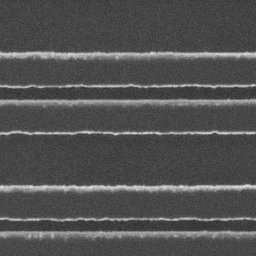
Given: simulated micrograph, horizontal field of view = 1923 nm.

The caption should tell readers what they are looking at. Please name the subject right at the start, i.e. lines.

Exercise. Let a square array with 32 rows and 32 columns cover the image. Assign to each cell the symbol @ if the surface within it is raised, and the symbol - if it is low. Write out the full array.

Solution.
--------------------------------
--------------------------------
--------------------------------
--------------------------------
--------------------------------
--------------------------------
--------------------------------
@@@@@@@@@@@@@@@@@@@@@@@@@@@@@@@@
@@@@@@@@@@@@@@@@@@@@@@@@@@@@@@@@
@@@@@@@@@@@@@@@@@@@@@@@@@@@@@@@@
@@@@@@@@@@@@@@@@@@@@@@@@@@@@@@@@
--------------------------------
--------------------------------
@@@@@@@@@@@@@@@@@@@@@@@@@@@@@@@@
@@@@@@@@@@@@@@@@@@@@@@@@@@@@@@@@
@@@@@@@@@@@@@@@@@@@@@@@@@@@@@@@@
@@@@@@@@@@@@@@@@@@@@@@@@@@@@@@@@
--------------------------------
--------------------------------
--------------------------------
--------------------------------
--------------------------------
--------------------------------
@@@@@@@@@@@@@@@@@@@@@@@@@@@@@@@@
@@@@@@@@@@@@@@@@@@@@@@@@@@@@@@@@
@@@@@@@@@@@@@@@@@@@@@@@@@@@@@@@@
@@@@@@@@@@@@@@@@@@@@@@@@@@@@@@@@
--------------------------------
--------------------------------
@@@@@@@@@@@@@@@@@@@@@@@@@@@@@@@@
@@@@@@@@@@@@@@@@@@@@@@@@@@@@@@@@
@@@@@@@@@@@@@@@@@@@@@@@@@@@@@@@@